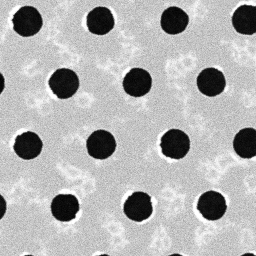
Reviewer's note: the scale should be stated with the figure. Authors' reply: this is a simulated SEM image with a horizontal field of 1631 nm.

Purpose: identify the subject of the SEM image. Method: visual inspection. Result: a regular array of holes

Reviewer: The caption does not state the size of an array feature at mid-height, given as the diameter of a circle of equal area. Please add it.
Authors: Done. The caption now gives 190 nanometers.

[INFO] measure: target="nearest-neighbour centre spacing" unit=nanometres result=456